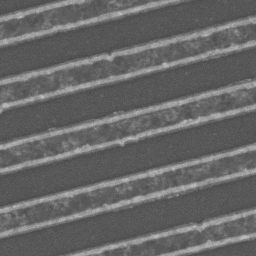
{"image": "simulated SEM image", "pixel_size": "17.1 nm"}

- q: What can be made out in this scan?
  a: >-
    one or a few lines or trenches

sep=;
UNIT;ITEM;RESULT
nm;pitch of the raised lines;1060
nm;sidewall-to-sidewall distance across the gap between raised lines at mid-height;667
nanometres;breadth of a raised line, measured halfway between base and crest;387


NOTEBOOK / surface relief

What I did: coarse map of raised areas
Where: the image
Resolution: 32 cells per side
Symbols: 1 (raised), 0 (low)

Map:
00000000111111111110000000000000
00001111111111110000000000000000
11111111111100000000000000000000
11111110000000000000000000001111
11100000000000000000000011111111
00000000000000000000111111111110
00000000000000001111111111100000
00000000000011111111111000000000
00000000111111111111000000000000
00001111111111110000000000000000
11111111111100000000000000000000
11111110000000000000000000011111
11100000000000000000000011111111
00000000000000000000111111111110
00000000000000001111111111100000
00000000000011111111111000000000
00000000111111111110000000000000
00001111111111110000000000000000
11111111111100000000000000000000
11111111000000000000000000001111
11110000000000000000000011111111
00000000000000000000111111111110
00000000000000001111111111100000
00000000000011111111111000000000
00000000111111111110000000000000
00011111111111100000000000000000
11111111111000000000000000000000
11111110000000000000000000001111
11100000000000000000000001111111
00000000000000000000111111111110
00000000000000001111111111100000
00000000000011111111111000000000